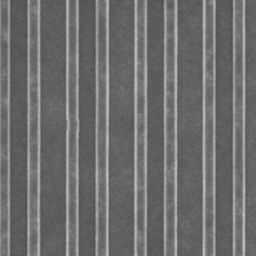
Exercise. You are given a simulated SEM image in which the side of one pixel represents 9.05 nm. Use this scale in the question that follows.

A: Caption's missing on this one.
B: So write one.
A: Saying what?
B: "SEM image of parallel lines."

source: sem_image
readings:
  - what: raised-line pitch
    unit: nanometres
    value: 309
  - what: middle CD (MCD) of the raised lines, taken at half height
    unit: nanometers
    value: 99.6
